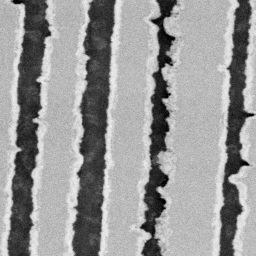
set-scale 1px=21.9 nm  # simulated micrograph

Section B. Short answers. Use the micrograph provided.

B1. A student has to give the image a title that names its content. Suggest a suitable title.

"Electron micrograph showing one or a few lines or trenches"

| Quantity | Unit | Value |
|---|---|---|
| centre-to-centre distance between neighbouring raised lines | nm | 1480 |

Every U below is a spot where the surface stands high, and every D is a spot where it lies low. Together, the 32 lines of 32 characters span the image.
UUDDDDUUUUUDDDDUUUUDDDUUUUUUUDDD
UUUDDDUUUUUDDDDUUUUDDDUUUUUUUDDD
UUUDDDUUUUUDDDDUUUUDDUUUUUUUUDDD
UUUDDDDUUUDDDDDUUUUDDUUUUUUUUDDD
UUUDDDDUUUDDDDUUUUUDDDUUUUUUUDDD
UUDDDDUUUUDDDDUUUUUDDDUUUUUUUDDU
UUDDDDUUUUDDDDUUUUUDDDUUUUUUUDDU
UUDDDDUUUUUDDDUUUUUDDDUUUUUUDDDU
UUDDDDUUUUUDDDUUUUUDDUUUUUUUDDDU
UUDDDDUUUUDDDDUUUUUDDUUUUUUUDDDU
UUDDDUUUUUDDDDUUUUUDDUUUUUUUDDDU
UUDDDUUUUUDDDDUUUUUDDUUUUUUUDDDU
UUDDDUUUUUDDDDUUUUUDDUUUUUUUDDDU
UUDDDUUUUDDDDDUUUUDDDUUUUUUUDDDU
UUDDDUUUUUDDDDUUUUUDDUUUUUUUDDDU
UUDDDUUUUDDDDDUUUUDDDUUUUUUUDDDU
UUDDDUUUUUDDDDUUUUDDDUUUUUUUDDUU
UUDDDUUUUDDDDDUUUUDDDUUUUUUUDDUU
UUDDDUUUUDDDDDUUUUUDDUUUUUUUDDDU
UDDDDUUUUUDDDDUUUUDDDUUUUUUUDDDU
UDDDDUUUUUDDDDUUUUDDDUUUUUUUDDDU
UDDDDUUUUDDDDUUUUUDDDUUUUUUUDDUU
UDDDDUUUUDDDDUUUUUDDDUUUUUUDDUUU
UDDDDUUUUDDDDUUUUUDDUUUUUUUDDDUU
UDDDUUUUUDDDDUUUUUDDUUUUUUUDDDUU
UDDDDUUUUDDDDUUUUUDDDUUUUUUDDDUU
UDDDUUUUUDDDDUUUUUDDUUUUUUUDDDDU
UDDDUUUUUDDDDUUUUUDDUUUUUUUDDDUU
UDDDUUUUUDDDDUUUUDDDUUUUUUUDDDUU
UDDDUUUUUDDDDUUUUUDDUUUUUUUDDDUU
DDDDUUUUUDDDDUUUUUDDUUUUUUUDDDUU
DDDDUUUUUDDDDUUUUDDDUUUUUUUDDDUU